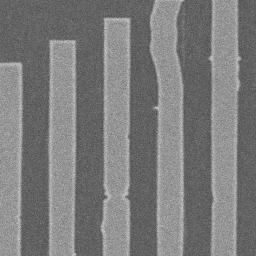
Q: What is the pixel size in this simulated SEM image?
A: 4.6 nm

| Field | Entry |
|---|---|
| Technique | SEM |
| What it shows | parallel lines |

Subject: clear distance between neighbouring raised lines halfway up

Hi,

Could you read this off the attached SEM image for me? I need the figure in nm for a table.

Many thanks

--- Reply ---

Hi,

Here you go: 134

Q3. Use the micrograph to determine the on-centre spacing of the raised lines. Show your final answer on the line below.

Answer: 250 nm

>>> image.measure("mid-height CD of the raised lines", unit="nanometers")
116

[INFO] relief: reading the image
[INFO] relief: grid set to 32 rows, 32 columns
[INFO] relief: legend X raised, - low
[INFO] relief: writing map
-------------------XXXX----XXX--
-------------------XXX-----XXX--
-------------XXX---XXX-----XXX--
-------------XXX---XXX-----XXX--
-------------XXX---XXX-----XXX--
------XXX----XXX---XXX-----XXX--
------XXX----XXX---XXX----XXXX--
------XXX----XXX---XXX----XXXX--
XXX---XXX----XXX---XXXX----XXX--
XXX---XXX----XXX----XXX----XXX--
XXX---XXX----XXX----XXX----XXX--
XXX---XXX----XXX----XXX----XXX--
XXX---XXX----XXX----XXX----XXX--
XXX---XXX----XXX----XXX---XXXX--
XXX---XXX----XXX----XXX---XXXX--
XXX---XXX----XXX----XXX---XXXX--
XXX---XXX----XXX----XXX---XXXX--
XXX---XXX----XXX----XXX---XXXX--
XXX---XXX----XXX----XXX---XXXX--
XXX---XXX----XXX----XXX----XXX--
XXX---XXX----XXX----XXX----XXX--
XXX---XXX----XXX----XXX----XXX--
XXX---XXX----XXX----XXX----XXX--
XX----XXX----XXX----XXX----XX---
XX----XXX----XXX----XXX----XX---
XX----XXX----XXX----XXX----XX---
XX----XXX----XXX----XXX----XX---
XX----XXX----XXX----XXX----XX---
XX----XXX----XXX----XXX----XX---
XX----XXX----XXX----XXX----XX---
XX----XXX----XXX----XXX---XXX---
XX----XXX----XXX----XXX---XXX---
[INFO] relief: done